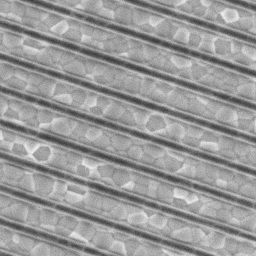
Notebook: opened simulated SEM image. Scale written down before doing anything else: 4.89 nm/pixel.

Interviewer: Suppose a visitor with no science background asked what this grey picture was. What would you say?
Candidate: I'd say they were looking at parallel lines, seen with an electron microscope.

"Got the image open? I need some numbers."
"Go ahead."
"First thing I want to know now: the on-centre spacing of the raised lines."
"153 nm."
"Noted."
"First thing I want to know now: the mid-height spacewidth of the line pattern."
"21.9 pixels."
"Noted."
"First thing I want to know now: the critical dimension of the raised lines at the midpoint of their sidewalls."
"49.4 nanometres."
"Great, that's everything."